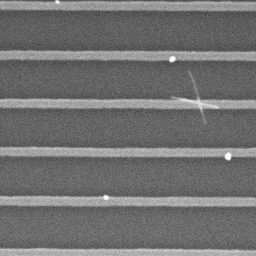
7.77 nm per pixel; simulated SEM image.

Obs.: lines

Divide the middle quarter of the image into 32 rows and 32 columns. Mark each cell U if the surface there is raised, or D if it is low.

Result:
DDDDDDDDDDDDDDDDDDDDDDDDDDDDDDDD
DDDDDDDDDDDDDDDDDDDDDDDDDDDDDDDD
DDDDDDDDDDDDDDDDDDDDDDDDDDDDDDDD
DDDDDDDDDDDDDDDDDDDDDDDDDDDDDDDD
DDDDDDDDDDDDDDDDDDDDDDDDDDDDDDDD
DDDDDDDDDDDDDDDDDDDDDDDDDDDDDDDD
DDDDDDDDDDDDDDDDDDDDDDDDDDDDDDDD
DDDDDDDDDDDDDDDDDDDDDDDDDDDDDDDD
DDDDDDDDDDDDDDDDDDDDDDDDDDDDDDDD
UUUUUUUUUUUUUUUUUUUUUUUUUUUUUUUU
UUUUUUUUUUUUUUUUUUUUUUUUUUUUUUUU
DDDDDDDDDDDDDDDDDDDDDDDDDDDDDDDD
DDDDDDDDDDDDDDDDDDDDDDDDDDDDDDDD
DDDDDDDDDDDDDDDDDDDDDDDDDDDDDDDD
DDDDDDDDDDDDDDDDDDDDDDDDDDDDDDDD
DDDDDDDDDDDDDDDDDDDDDDDDDDDDDDDD
DDDDDDDDDDDDDDDDDDDDDDDDDDDDDDDD
DDDDDDDDDDDDDDDDDDDDDDDDDDDDDDDD
DDDDDDDDDDDDDDDDDDDDDDDDDDDDDDDD
DDDDDDDDDDDDDDDDDDDDDDDDDDDDDDDD
DDDDDDDDDDDDDDDDDDDDDDDDDDDDDDDD
UUUUUUUUUUUUUUUUUUUUUUUUUUUUUUUU
UUUUUUUUUUUUUUUUUUUUUUUUUUUUUUUU
DDDDDDDDDDDDDDDDDDDDDDDDDDDDDDDD
DDDDDDDDDDDDDDDDDDDDDDDDDDDDDDDD
DDDDDDDDDDDDDDDDDDDDDDDDDDDDDDDD
DDDDDDDDDDDDDDDDDDDDDDDDDDDDDDDD
DDDDDDDDDDDDDDDDDDDDDDDDDDDDDDDD
DDDDDDDDDDDDDDDDDDDDDDDDDDDDDDDD
DDDDDDDDDDDDDDDDDDDDDDDDDDDDDDDD
DDDDDDDDDDDDDDDDDDDDDDDDDDDDDDDD
DDDDDDDDDDDDDDDDDDDDDDDDDDDDDDDD